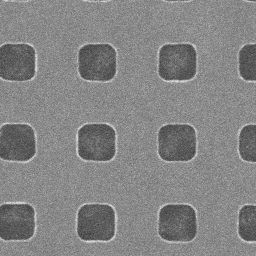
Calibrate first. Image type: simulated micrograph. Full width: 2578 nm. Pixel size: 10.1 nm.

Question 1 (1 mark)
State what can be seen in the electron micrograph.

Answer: holes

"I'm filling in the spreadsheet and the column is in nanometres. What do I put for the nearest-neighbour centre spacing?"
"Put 807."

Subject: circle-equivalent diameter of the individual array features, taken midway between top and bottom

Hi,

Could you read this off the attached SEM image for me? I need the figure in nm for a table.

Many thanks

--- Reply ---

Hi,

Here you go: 413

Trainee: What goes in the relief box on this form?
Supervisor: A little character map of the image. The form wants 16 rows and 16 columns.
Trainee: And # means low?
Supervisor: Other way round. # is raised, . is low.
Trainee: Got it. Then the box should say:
################
################
################
..###..###..###.
..###..###..###.
################
################
################
..###..###..###.
..###..###..###.
################
################
################
..###..###..###.
..###..###..###.
################